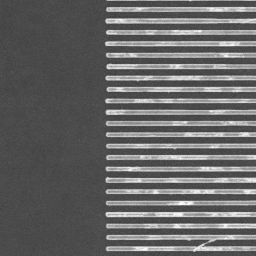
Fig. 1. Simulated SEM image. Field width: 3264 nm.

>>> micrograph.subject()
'parallel lines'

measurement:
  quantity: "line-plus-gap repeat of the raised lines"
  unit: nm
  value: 146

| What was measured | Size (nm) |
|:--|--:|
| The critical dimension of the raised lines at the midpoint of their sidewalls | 47.8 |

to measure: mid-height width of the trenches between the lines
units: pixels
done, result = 7.38